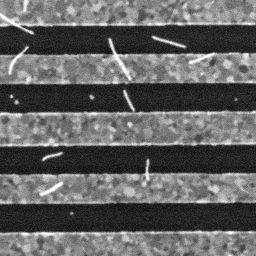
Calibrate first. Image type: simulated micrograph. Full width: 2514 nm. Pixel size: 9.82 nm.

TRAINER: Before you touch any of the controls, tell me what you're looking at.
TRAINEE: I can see lines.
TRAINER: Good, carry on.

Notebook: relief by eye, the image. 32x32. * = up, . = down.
********************************
********************************
********************************
................................
................................
................................
................................
********************************
********************************
********************************
................................
................................
................................
................................
********************************
********************************
********************************
********************************
................................
................................
................................
................................
********************************
********************************
********************************
................................
................................
................................
................................
********************************
********************************
********************************